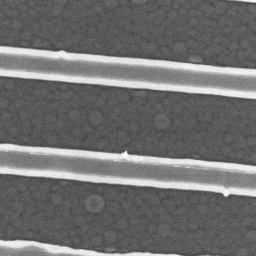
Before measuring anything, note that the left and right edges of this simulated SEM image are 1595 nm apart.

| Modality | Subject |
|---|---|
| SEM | one or a few lines or trenches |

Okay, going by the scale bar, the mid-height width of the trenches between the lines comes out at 446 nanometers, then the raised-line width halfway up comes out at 154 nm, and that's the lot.